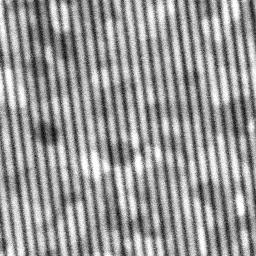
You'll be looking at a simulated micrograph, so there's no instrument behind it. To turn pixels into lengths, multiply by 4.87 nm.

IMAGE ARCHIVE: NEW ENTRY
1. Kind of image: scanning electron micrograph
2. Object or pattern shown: parallel lines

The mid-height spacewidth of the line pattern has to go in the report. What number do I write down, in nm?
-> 22.9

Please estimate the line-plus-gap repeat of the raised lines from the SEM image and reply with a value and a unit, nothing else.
51.7 nm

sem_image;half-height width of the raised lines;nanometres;27.7